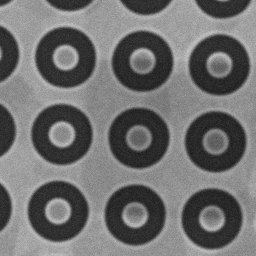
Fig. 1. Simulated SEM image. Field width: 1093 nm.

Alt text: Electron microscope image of an array of small figures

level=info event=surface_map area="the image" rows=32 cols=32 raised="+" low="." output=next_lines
.+++++.....++++......+++.......+
++++++++.+++++++....+++++......+
+++++++++++++++++++++++++++.++++
.++++++...++++++++++++++++++++++
..+++......++++.....++++++...+++
..+++.......++.......++++.....++
...+...+++..++...++...++.......+
..++...+++..++..+++...++..+++..+
..++...++...++...++...+...+++..+
.++++.......++.......+++...+...+
++++++....+++++......+++.......+
+++++++++++++++++..++++++.....++
++++++++++++++++++++++++++++++++
.+++++....++++++...+++++++++++++
..+++......++++.....+++++....+++
..++...++..+++.......+++......++
..++..+++...+...+++..++...++...+
..++..+++...+...+++..++..+++...+
.+++.......+++..++...++...++...+
.++++......+++.......++.......++
++++++...++++++.....++++......++
++++++++++++++++++++++++++..++++
+++++++.++++++++++++++++++++++++
.++++.....+++++....+++++++.+++++
.+++.......+++......++++.....+++
..+...+++..++...+....++.......++
..+...+++..++..+++...++..+++..++
.++...++...++..+++...++..+++..++
.+++.......++........++...+...++
+++++.....++++......+++.......++
+++++++++++++++...++++++.....+++
++++++++++++++++++++++++++++++++